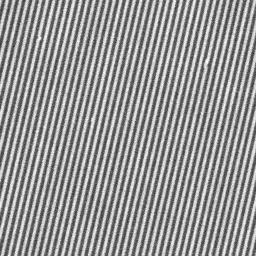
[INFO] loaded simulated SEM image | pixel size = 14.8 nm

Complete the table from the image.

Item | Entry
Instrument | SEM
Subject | parallel lines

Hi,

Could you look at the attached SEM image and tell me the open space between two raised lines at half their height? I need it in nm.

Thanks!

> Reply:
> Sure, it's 57.8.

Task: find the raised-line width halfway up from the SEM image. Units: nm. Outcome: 28.9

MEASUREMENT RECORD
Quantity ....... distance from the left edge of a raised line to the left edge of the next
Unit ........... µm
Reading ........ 0.0968